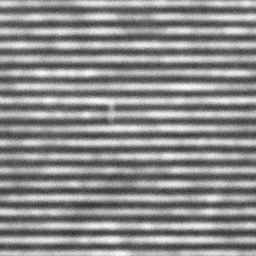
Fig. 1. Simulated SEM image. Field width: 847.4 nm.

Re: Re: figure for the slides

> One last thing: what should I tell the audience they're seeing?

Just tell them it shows parallel lines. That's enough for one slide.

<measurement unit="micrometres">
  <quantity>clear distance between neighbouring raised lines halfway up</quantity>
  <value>0.034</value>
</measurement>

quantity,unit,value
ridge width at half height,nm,12.4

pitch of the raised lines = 46 nm